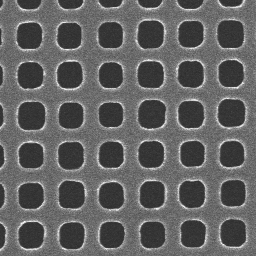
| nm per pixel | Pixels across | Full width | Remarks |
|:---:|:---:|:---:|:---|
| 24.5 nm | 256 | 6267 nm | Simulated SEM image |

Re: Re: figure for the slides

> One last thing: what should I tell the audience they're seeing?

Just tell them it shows a regular array of holes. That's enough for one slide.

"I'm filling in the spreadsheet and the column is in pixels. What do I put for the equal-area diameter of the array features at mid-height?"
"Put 27.7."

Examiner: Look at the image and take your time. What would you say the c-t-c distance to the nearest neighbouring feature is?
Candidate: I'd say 968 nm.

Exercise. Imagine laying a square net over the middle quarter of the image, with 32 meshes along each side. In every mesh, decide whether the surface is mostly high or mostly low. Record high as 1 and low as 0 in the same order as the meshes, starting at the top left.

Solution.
00001111100000111110000001111000
00001111100000011100000001110000
00000111000000011100000001110000
00000111000000011100000001110000
00000111100000011110000001111000
00001111110000111110000011111100
11111111111111111111111111111111
11111111111111111111111111111111
11111111111111111111111111111111
10111111111111111111000001111100
00001111100000111110000001111000
00000111100000011100000001110000
00000111100000011100000001110000
00000111100000011100000001110000
00000111100000011110000001111000
00001111110000111110000011111100
11111111111111111111111111111111
11111111111111111111111111111111
11111111111111111111111111111111
10011111110001111111000011111110
00000111100000011110000001111000
00000111100000011110000001111000
00000111100000011100000001111000
00000111100000011100000001111000
00000111100000011110000001111000
00001111110000111111000011111100
11111111111111111111111111111111
11111111111111111111111111111111
11111111111111111111111111111111
00001111111111111111100011111100
00000111100000111110000001111000
00000111100000011110000001111000